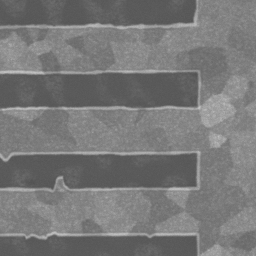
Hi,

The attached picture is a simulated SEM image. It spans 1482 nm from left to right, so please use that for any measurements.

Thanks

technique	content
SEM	one or a few lines or trenches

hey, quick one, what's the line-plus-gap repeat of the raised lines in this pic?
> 0.47 micrometres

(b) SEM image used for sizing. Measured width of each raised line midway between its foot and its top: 263 nm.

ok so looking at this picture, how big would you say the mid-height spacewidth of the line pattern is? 0.208 micrometres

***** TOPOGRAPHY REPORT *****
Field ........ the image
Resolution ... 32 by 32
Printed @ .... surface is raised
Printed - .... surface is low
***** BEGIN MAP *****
-------------------------@@@@@@@
-------------------------@@@@@@@
------------------------@@@@@@@@
@@@@@@@@@@@@@@@@@@@@@@@@@@@@@@@@
@@@@@@@@@@@@@@@@@@@@@@@@@@@@@@@@
@@@@@@@@@@@@@@@@@@@@@@@@@@@@@@@@
@@@@@@@@@@@@@@@@@@@@@@@@@@@@@@@@
@@@@@@@@@@@@@@@@@@@@@@@@@@@@@@@@
@@@@@@@@@@@@@@@@@@@@@@@@@@@@@@@@
-------------------------@@@@@@@
-------------------------@@@@@@@
-------------------------@@@@@@@
-------------------------@@@@@@@
---------------------@--@@@@@@@@
@@@@@@@@@@@@@@@@@@@@@@@@@@@@@@@@
@@@@@@@@@@@@@@@@@@@@@@@@@@@@@@@@
@@@@@@@@@@@@@@@@@@@@@@@@@@@@@@@@
@@@@@@@@@@@@@@@@@@@@@@@@@@@@@@@@
@@@@@@@@@@@@@@@@@@@@@@@@@@@@@@@@
@------------------------@@@@@@@
-------------------------@@@@@@@
-------------------------@@@@@@@
-------@-----------------@@@@@@@
-------@----------------@@@@@@@@
@@@@@@@@@@@@@@@@@@@@@@@@@@@@@@@@
@@@@@@@@@@@@@@@@@@@@@@@@@@@@@@@@
@@@@@@@@@@@@@@@@@@@@@@@@@@@@@@@@
@@@@@@@@@@@@@@@@@@@@@@@@@@@@@@@@
@@@@@@@@@@@@@@@@@@@@@@@@@@@@@@@@
----@@-------------------@@@@@@@
-------------------------@@@@@@@
-------------------------@@@@@@@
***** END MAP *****